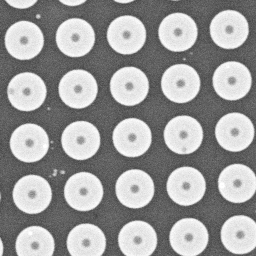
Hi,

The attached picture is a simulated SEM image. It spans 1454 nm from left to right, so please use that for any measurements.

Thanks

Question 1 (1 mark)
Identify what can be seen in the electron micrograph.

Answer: an array of small figures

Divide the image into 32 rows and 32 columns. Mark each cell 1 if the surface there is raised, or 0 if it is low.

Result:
01110000110000000000000000000000
00000000000000000000000000001100
00000000010000111000111100011110
01111001111000111100111110111110
01111001111101111100111110111110
01111001111100111100111100011100
01111000111000011000000000000000
00000000000000000000000000000000
00000000000000011000011100011110
00111000111000111100111110011110
01111101111100111110111110011110
01111101111100111100111110011110
01111000111100011100011100000000
00111000010000000000000000000000
00000000000000000000000000001110
00010000011000011100011110011110
00111100111100111110011110011111
01111100111100111110011110011111
01111100111100011110011110001110
00111000011000001000000000000000
00000000000000000000000000000000
00000000000000001100001110001111
00111100011100011110011111011111
00111100111110011110011111011111
00111100111110011110011110001110
00111100011100011100001100000000
00011000000000000000000000000000
00000000000000000000000110000111
00011000011100011110001111001111
00111100011110011111011111001111
00111110111110011111011111001111
00111110011110011110001110000110